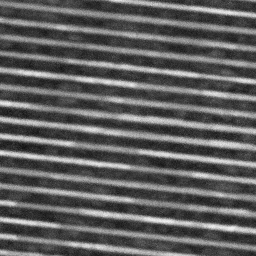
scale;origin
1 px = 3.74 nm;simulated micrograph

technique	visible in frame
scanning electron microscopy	parallel lines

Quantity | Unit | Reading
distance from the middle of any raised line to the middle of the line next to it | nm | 61.7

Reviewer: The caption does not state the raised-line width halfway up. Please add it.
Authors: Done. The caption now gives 15.8 nm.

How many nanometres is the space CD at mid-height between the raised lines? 47.8